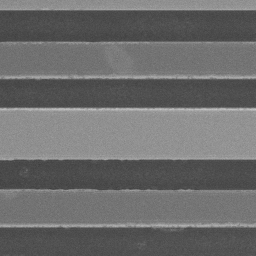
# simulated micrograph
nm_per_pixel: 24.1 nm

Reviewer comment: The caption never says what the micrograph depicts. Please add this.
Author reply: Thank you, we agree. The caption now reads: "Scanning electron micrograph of lines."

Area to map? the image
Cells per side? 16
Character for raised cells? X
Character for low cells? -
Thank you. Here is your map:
XXXXXXXXXXXXXXXX
----------------
----------------
XXXXXXXXXXXXXXXX
XXXXXXXXXXXXXXXX
----------------
----------------
XXXXXXXXXXXXXXXX
XXXXXXXXXXXXXXXX
XXXXXXXXXXXXXXXX
----------------
----------------
XXXXXXXXXXXXXXXX
XXXXXXXXXXXXXXXX
----------------
----------------